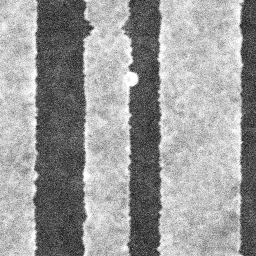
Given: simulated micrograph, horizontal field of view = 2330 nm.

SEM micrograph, one or a few lines or trenches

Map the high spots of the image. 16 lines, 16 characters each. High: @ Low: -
@@---@@@--@@@@@-
@@----@@--@@@@@-
@@---@@@--@@@@@-
@@---@@@--@@@@@-
@@---@@@--@@@@@-
@@---@@@--@@@@@-
@@---@@@--@@@@@-
@@---@@@--@@@@@-
@@---@@@--@@@@@-
@@---@@@--@@@@@-
@@---@@@--@@@@@-
@@---@@@--@@@@@-
@@---@@@--@@@@@-
@@---@@@--@@@@@-
@@---@@@--@@@@@-
@@---@@@--@@@@@-